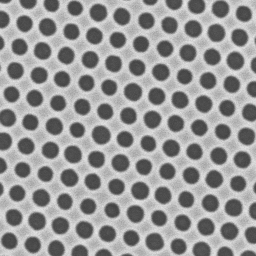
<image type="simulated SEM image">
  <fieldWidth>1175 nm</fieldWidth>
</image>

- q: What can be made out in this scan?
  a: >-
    a regular array of holes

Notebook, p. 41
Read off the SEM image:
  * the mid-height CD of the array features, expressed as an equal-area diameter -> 17.2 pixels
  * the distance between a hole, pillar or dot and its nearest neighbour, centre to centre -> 108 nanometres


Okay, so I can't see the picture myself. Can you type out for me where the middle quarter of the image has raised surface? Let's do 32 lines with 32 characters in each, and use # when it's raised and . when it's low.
#####...##.....#....###...######
###########...##....##....###..#
.################...##....##....
..##...################...##....
..##....##...################...
.###....#....##....#############
#####..##....##.....##...#######
##########...##....##....##...##
################...##....##....#
###...################...##....#
###....##...################...#
###...##....##....##############
####..##....##....##....########
#########...##....##....##...###
###############...##....##....##
##...###..###########...##....##
#....##....################..###
##...##.....#....###############
###.###.....#....##...##########
########...##....##....##...####
#..###########...##....##....##.
....################..###....##.
....##....####.##########....##.
....##....##....###############.
#...##....##....##....##########
#######..###....##....##...#####
...##########...##....##....##..
...###..###########..###....##..
....#....###############...###..
...##....##....###.###########..
#..###...##....##....###########
#######.###....##....##...######